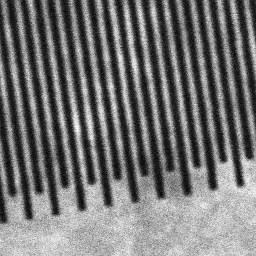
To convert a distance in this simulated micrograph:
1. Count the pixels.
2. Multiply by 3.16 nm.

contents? parallel lines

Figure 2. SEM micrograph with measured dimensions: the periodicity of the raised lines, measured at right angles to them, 42.1 nm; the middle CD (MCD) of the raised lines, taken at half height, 17.2 nm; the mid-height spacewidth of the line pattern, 25.7 nm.